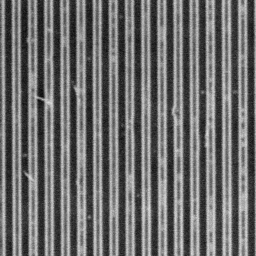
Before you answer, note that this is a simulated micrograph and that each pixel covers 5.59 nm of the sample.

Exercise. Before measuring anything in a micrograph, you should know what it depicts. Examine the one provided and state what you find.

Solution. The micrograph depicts parallel lines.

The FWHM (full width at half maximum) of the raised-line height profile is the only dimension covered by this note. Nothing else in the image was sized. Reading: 38.4 nm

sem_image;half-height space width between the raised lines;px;9.5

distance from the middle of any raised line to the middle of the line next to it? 0.0904 micrometres